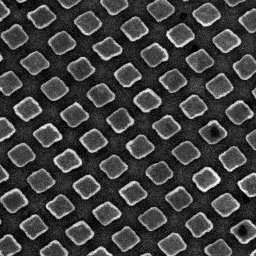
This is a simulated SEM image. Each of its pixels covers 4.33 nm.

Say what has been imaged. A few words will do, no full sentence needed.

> a regular array of raised bodies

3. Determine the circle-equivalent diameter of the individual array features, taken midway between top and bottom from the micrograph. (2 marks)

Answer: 100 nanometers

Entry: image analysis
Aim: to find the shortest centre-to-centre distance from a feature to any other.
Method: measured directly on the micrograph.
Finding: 140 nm